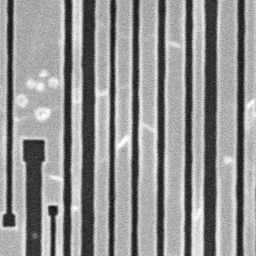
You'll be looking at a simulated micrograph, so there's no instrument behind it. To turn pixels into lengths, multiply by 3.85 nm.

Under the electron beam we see groups of lines, slits or small figures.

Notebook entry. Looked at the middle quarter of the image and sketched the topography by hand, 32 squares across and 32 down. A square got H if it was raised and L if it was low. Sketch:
LLHHLLLLHHHLLHHHHLLHHHHLLLHHHHLL
LLHHLLLLHHHLLHHHHLLHHHHLLLHHHHLL
LLHHLLLLHHHLLHHHHLLHHHHLLLHHHHLL
LLHHLLLLHHHLLHHHHLLHHHHLLHHHHHLL
LLHHLLLLHHHLLHHHHLLHHHHLLHHHHHLL
LLHHLLLLHHHLLHHHHLLHHHHLLHHHHHLL
LLHHLLLLHHHLLHHHHLLHHHHLLHHHHHLL
LLHHLLLLHHHLLHHHHLLHHHHLLHHHHHLL
LLHHLLLLHHHLLHHHHLLHHHHLLHHHHHLL
LLHHLLLLHHHLLHHHHLLHHHHLLHHHHHLL
LLHHLLLLHHHLLHHHHLLHHHHLLHHHHHLL
LLHHLLLLHHHLLHHHHLLHHHHLLHHHHHLL
LLHHLLLLHHHLLHHHHLLHHHHLLHHHHHLL
LLHHLLLLHHHLLHHHHLLHHHHLLHHHHHLL
LLHHLLLLHHHLLHHHHLLHHHHLLHHHHHLL
LLHHLLLLHHHLLHHHHLLHHHHLLHHHHHLL
LLHHLLLLHHHLLHHHHLLHHHHLLHHHHHLL
LLHHLLLLHHHLLHHHHLLHHHHLLHHHHHLL
LLHHLLLLHHHLLHHHHLLHHHHLLHHHHHLL
LLHHLLLLHHHLLHHHHLLHHHHLLHHHHHLL
LLHHLLLLHHHLLHHHHLLHHHHLLHHHHHLL
LLHHLLLLHHHLLHHHHLLHHHHLLHHHHHLL
LLHHLLLLHHHLLHHHHLLHHHHLLHHHHHLL
LLHHLLLLHHHLLHHHHLLHHHHLLHHHHHLL
LLHHLLLLHHHLLHHHHLLHHHHLLHHHHHLL
LLHHLLLLHHHLLHHHLLLHHHHLLHHHHHLL
LLHHLLLLHHHLLHHHHLLHHHHLLHHHHHLL
LLHHLLLLHHHLLHHHHLLHHHHLLHHHHHLL
LLHHLLLLHHHLLHHHHLLHHHHLLHHHHHLL
LLHHLLLLHHHLLHHHHLLHHHHLLHHHHHLL
LLHHLLLLHHHLLHHHHLLHHHHLLHHHHHLL
LLHHLLLLHHHLLHHHHLLHHHHLLHHHHHLL